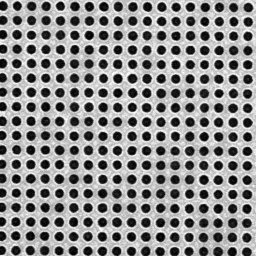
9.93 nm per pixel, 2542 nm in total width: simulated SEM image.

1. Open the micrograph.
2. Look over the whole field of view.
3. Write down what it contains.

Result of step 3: a regular array of holes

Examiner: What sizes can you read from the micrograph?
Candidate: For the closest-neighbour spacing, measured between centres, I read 141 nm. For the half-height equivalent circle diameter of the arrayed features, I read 100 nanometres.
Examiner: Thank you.